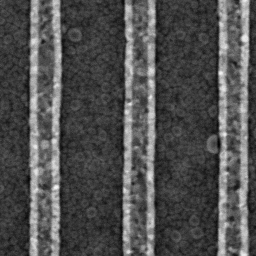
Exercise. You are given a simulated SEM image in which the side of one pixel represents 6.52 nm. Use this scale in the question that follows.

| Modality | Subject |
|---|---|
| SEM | one or a few lines or trenches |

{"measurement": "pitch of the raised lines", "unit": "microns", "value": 0.615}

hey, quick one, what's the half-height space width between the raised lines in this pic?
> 464 nanometres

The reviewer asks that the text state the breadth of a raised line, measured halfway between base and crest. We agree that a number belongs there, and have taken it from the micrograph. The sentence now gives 152 nanometers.